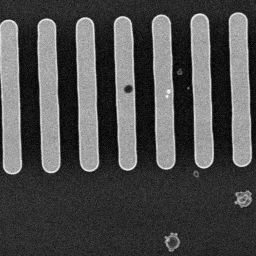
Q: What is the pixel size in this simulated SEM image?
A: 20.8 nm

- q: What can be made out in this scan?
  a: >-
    groups of lines, slits or small figures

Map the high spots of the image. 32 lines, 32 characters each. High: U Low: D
DDDDDDDDDDDDDDDDDDDDDDDDDDDDDDDD
DDDDDDDDDDDDDDDDDDDDDDDDDDDDDDDD
DDDDDUDDDDUDDDDUDDDUUDDDUUDDDUUD
UUDDDUUDDDUUDDUUDDDUUDDDUUDDDUUD
UUDDDUUDDDUUDDUUUDDUUDDDUUDDDUUD
UUDDDUUDDDUUDDUUUDDUUDDDUUDDDUUD
UUDDDUUDDDUUDDUUUDDUUDDDUUDDDUUD
UUDDDUUDDDUUDDUUUDDUUDDDUUDDDUUD
UUDDDUUDDDUUDDDUUDDUUDDDUUDDDUUD
UUDDDUUDDDUUDDDUUDDUUDDDUUDDDUUD
UUDDDUUDDDUUDDDUUDDUUUDDUUDDDUUD
UUDDDUUDDDUUDDDUUDDUUUDDUUDDDUUD
UUDDDUUDDDUUDDDUUDDUUUDDUUDDDUUD
UUDDDUUDDDUUDDDUUDDUUUDDUUDDDUUD
UUDDDUUDDDUUDDDUUDDUUUDDUUDDDUUD
UUDDDUUDDDUUDDDUUDDUUUDDUUDDDUUD
UUDDDUUDDDUUDDDUUDDUUUDDUUUDDUUD
UUUDDUUDDDUUDDDUUDDUUUDDUUUDDUUD
UUUDDUUDDDUUDDDUUDDDUUDDUUUDDUUD
UUUDDUUDDDUUDDDUUDDDUUDDUUUDDUUD
UUUDDUUDDDUUDDDUUDDDUUDDDUDDDDUD
DUDDDDUDDDDDDDDDDDDDDDDDDDDDDDDD
DDDDDDDDDDDDDDDDDDDDDDDDDDDDDDDD
DDDDDDDDDDDDDDDDDDDDDDDDDDDDDDDD
DDDDDDDDDDDDDDDDDDDDDDDDDDDDDDDD
DDDDDDDDDDDDDDDDDDDDDDDDDDDDDDDD
DDDDDDDDDDDDDDDDDDDDDDDDDDDDDDDD
DDDDDDDDDDDDDDDDDDDDDDDDDDDDDDDD
DDDDDDDDDDDDDDDDDDDDDDDDDDDDDDDD
DDDDDDDDDDDDDDDDDDDDDDDDDDDDDDDD
DDDDDDDDDDDDDDDDDDDDDDDDDDDDDDDD
DDDDDDDDDDDDDDDDDDDDDDDDDDDDDDDD